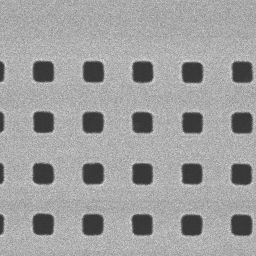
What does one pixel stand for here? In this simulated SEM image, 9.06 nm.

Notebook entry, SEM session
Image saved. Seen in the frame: a regular array of holes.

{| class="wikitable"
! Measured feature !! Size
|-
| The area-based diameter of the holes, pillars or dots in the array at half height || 214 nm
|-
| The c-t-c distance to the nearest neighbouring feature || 448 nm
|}